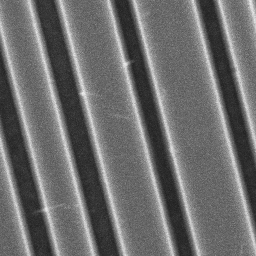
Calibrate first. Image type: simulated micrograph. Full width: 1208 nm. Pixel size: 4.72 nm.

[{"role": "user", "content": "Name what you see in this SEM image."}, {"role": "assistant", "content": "one or a few lines or trenches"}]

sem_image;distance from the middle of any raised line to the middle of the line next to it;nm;348